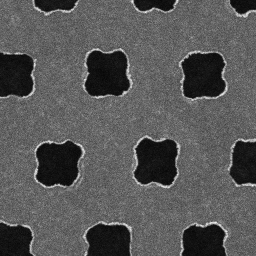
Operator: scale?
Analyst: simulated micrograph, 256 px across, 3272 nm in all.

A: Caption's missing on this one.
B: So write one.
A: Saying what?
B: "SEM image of holes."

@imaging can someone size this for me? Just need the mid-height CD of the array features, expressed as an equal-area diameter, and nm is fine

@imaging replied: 596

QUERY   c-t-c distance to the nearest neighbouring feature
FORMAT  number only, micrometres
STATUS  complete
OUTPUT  1.25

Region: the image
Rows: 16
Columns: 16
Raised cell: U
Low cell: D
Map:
UUDDUUUUUDDUUUUD
UUUUUUUUUUUUUUUU
UUUUUUUUUUUUUUUU
DDUUUUDDUUUUDDUU
DDUUUDDDUUUDDDUU
DDUUUDDDUUUDDDUU
UUUUUUUUUUUUUUUU
UUUUUUUUUUUUUUUU
UUUUUUUUUUUUUUUU
UUDDDUUUUDDUUUUD
UUDDDUUUUDDUUUDD
UUUDUUUUUUUUUUUU
UUUUUUUUUUUUUUUU
UUUUUUUUUUUUUUUU
DDUUUUDDUUUUDDUU
DDUUUDDDUUUDDDUU